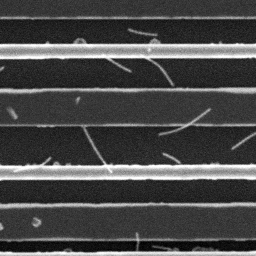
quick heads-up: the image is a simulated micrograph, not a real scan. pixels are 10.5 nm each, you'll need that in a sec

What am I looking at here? lines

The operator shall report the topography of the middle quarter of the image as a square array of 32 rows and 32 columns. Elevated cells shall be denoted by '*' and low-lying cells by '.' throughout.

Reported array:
................................
................................
................................
................................
................................
................................
********************************
********************************
********************************
********************************
********************************
********************************
********************************
********************************
********************************
..............................*.
................................
................................
................................
................................
................................
................................
................................
................................
................................
.........***.***.**..******.****
********************************
********************************
********************************
................................
................................
................................